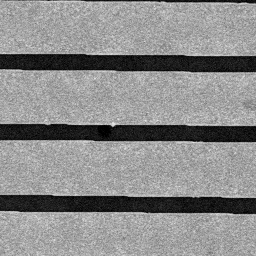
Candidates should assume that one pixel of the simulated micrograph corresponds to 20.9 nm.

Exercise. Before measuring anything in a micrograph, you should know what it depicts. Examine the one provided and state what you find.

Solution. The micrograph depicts lines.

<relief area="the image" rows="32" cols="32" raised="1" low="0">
11111111111111111111111111111110
11111111111111111111111111111111
11111111111111111111111111111111
11111111111111111111111111111111
11111111111111111111111111111111
11111111111111111111111111111111
11111111111111111111111111111111
00000000000000000000000000000000
00000000000000000000000000000000
11111111111111111111111111111111
11111111111111111111111111111111
11111111111111111111111111111111
11111111111111111111111111111111
11111111111111111111111111111111
11111111111111111111111111111111
00000000111111111111111111111111
00000000000000000000000000000000
00000000000000000000000000000000
11111111111111111111111111111111
11111111111111111111111111111111
11111111111111111111111111111111
11111111111111111111111111111111
11111111111111111111111111111111
11111111111111111111111111111111
00000000000000001111111111111111
00000000000000000000000000000000
11100000000000000000000000000000
11111111111111111111111111111111
11111111111111111111111111111111
11111111111111111111111111111111
11111111111111111111111111111111
11111111111111111111111111111111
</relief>